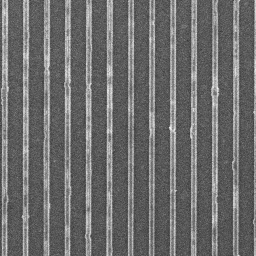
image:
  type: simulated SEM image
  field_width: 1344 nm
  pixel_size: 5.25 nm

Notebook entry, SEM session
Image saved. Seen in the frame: parallel lines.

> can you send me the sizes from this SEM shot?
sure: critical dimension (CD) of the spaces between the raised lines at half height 85.2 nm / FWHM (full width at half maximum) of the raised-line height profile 24.9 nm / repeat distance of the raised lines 110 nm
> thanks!